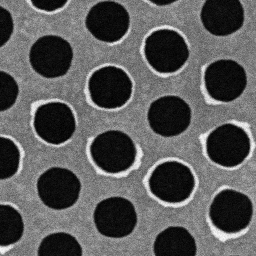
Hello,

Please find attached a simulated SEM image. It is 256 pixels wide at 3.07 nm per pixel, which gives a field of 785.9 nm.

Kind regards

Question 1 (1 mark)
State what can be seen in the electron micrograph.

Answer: a regular array of holes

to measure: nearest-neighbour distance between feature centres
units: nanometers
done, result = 201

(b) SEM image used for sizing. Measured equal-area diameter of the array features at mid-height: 0.132 um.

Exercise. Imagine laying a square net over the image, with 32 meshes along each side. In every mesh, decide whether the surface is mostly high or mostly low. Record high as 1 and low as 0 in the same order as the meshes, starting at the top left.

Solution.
11110000111100011111011111000011
01111111111000001111111110000011
00111111111000001111111110000011
00111111111000001111111111000011
01111101111100011110000111101111
11110000011111111100000111111111
11110000011111111100000011111111
11110000011111111100000111110111
11110000011110011110001111000011
01111000111000001111111111000001
00111111111000001111111111000001
00111111111000001111111111000011
00111111111100001111000111100111
01111000011110111110000011111111
11110000011111111100000011111111
11110000011111111110000011111111
11111000011110011110000111000001
01111100111100001111111111000001
00111111111000000111111111000001
00111111111000000111111111000001
00111111111100001111000111100011
00111100011111011110000011111111
11111000001111111110000011111111
11111000001111111110000011111111
11111000001111111111000011100001
11111100011100001111111111000001
00111111111100000111111111000000
00011111111100000111111111000001
00011111111100000111100111100001
00011100011110001111000011111111
01111000001111111110000011111111
11111000001111111110000011111111